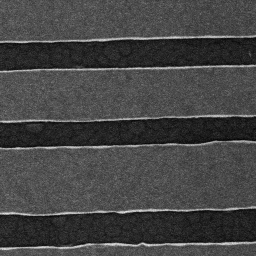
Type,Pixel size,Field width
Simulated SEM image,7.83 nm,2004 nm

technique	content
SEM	one or a few lines or trenches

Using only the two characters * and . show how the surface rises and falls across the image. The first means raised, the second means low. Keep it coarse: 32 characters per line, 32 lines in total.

********************************
********************************
********************************
********************************
********************************
................................
................................
................................
.......................*********
********************************
********************************
********************************
********************************
********************************
****************************...*
................................
................................
................................
....****************************
********************************
********************************
********************************
********************************
********************************
********************************
********************************
************..**................
................................
................................
................................
....................*..**...****
********************************